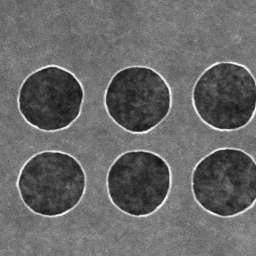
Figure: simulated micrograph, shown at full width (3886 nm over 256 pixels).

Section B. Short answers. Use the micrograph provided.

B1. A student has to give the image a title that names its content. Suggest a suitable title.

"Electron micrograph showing holes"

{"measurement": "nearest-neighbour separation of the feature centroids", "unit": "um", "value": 1.28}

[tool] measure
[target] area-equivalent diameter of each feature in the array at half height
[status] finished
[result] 970 nanometres